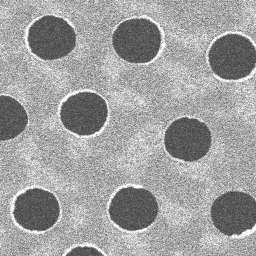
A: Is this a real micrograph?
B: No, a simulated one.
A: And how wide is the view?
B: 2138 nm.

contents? holes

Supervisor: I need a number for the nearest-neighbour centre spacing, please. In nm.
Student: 725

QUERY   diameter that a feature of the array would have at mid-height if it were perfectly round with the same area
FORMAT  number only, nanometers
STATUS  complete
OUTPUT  388